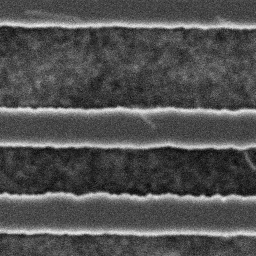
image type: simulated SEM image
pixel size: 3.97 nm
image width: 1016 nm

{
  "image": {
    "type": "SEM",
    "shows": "lines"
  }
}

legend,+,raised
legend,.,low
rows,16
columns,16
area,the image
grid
++++++++++++++++
++++++++++++++++
................
................
................
................
................
++++++++++++++++
++++++++++++++++
................
................
................
++++++++++++++++
++++++++++++++++
++++++++++++++++
................